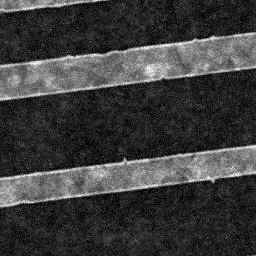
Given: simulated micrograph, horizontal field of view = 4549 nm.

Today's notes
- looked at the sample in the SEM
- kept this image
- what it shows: one or a few lines or trenches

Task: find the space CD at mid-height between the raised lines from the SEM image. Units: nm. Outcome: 1390